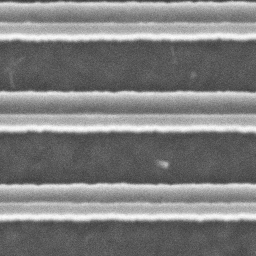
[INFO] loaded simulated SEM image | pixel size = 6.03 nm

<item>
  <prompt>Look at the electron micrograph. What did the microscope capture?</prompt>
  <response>lines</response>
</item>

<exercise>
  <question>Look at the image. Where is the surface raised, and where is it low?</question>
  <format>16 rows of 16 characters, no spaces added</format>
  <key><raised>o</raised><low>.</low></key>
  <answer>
oooooooooooooooo
oooooooooooooooo
................
................
................
................
oooooooooooooooo
oooooooooooooooo
................
................
................
................
oooooooooooooooo
ooooooooooooooo.
................
................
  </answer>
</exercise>